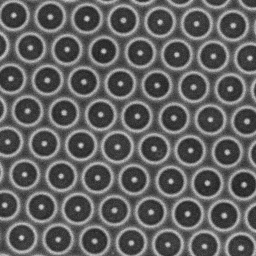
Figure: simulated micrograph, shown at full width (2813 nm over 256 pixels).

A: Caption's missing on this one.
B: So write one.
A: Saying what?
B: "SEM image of an array of small figures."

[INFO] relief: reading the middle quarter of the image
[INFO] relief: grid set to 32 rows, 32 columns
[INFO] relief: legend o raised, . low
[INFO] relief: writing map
oooooooooooooooooo..oooooo....oo
ooo....ooooooooooooooooooooooooo
oo......oooo....ooooo....oooooo.
oo......ooo......ooo......oooo..
o.......ooo.......oo......ooo...
oo......ooo.......oo...o...oo...
oo......ooo......ooo......ooo...
ooo....ooooo....ooooo.....ooo...
oooooooooooooooooooooo..oooooo..
..oooooo...ooooooooooooooooooooo
...oooo.....oooo....oooooo...ooo
...ooo......ooo......oooo.....oo
...ooo...o...oo.......oo.......o
...ooo......ooo...o...oo...o...o
...ooo......ooo......ooo.......o
.oooooo....ooooo.....oooo.....oo
ooooooooooooooooo..ooooooo...ooo
oo....oooooo...ooooooooooooooooo
o......oooo.....oooo.....ooooo..
o.......oo.......oo.......ooo...
o...o...oo...o...oo.......oo....
o......ooo.......oo...o...oo...o
oo.....ooo......ooo.......oo....
ooo...ooooo.....oooo.....oooo...
oooooooooooooooooooooo.ooooooo..
..ooooo...ooooooo.oooooooooooooo
..oooo.....oooo.....ooooo....ooo
...oo.......oo......oooo......oo
...oo...o...oo.......ooo......oo
..ooo.......oo.......oo...o...oo
..oooo.....oooo......ooo......oo
ooooooo...ooooo.....oooo......oo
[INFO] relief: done